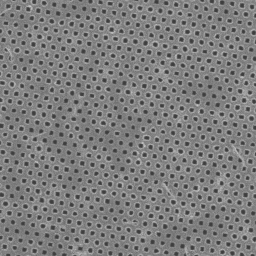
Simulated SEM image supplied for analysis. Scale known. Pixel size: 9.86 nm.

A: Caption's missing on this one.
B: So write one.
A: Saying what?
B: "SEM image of a regular array of holes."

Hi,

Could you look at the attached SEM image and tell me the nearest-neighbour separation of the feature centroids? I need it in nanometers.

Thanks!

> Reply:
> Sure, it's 94.4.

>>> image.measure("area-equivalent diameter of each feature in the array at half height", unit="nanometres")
44.5